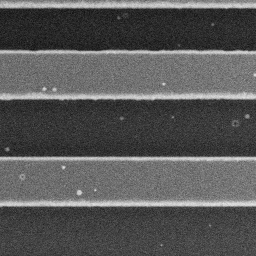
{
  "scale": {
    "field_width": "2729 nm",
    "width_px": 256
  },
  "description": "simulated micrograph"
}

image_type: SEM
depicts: lines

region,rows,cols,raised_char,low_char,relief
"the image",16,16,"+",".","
................
................
................
++++++++++++++++
++++++++++++++++
++++++++++++++++
................
................
................
................
++++++++++++++++
++++++++++++++++
++++++++++++++++
................
................
................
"